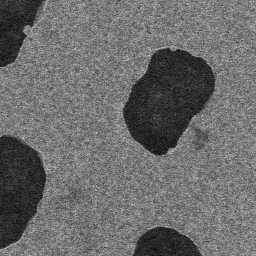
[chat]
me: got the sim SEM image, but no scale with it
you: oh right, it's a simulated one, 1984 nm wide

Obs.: holes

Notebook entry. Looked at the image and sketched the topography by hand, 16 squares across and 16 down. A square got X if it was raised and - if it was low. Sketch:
---XXXXXXXXXXXXX
--XXXXXXXXXXXXXX
-XXXXXXXXXXXXXXX
-XXXXXXXXX--XXXX
XXXXXXXXX----XXX
XXXXXXXX-----XXX
XXXXXXXX-----XXX
XXXXXXXX----XXXX
-XXXXXXX---XXXXX
--XXXXXXX-XXXXXX
---XXXXXXXXXXXXX
---XXXXXXXXXXXXX
---XXXXXXXXXXXXX
--XXXXXXXXXXXXXX
-XXXXXXXX--XXXXX
XXXXXXXX----XXXX